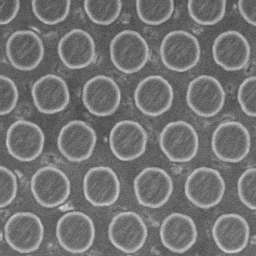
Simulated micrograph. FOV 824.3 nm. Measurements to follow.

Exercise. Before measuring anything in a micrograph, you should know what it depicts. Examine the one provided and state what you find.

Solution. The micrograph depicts a regular array of raised bodies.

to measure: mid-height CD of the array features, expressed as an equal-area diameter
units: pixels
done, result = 38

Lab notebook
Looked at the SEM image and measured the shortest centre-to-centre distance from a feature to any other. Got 165 nm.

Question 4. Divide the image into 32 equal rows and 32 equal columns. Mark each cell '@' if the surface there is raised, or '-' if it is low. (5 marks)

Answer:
@@--@@@@@--@@@@--@@@@@--@@@@--@@
@@--@@@@---@@@@--@@@@---@@@@--@@
@----@@@----@@----@@@---@@@----@
--------------------------------
-@@@@---@@@----@@@---@@@---@@@--
-@@@@--@@@@@--@@@@--@@@@@--@@@@-
-@@@@--@@@@@--@@@@--@@@@@--@@@@-
-@@@@---@@@---@@@@--@@@@@--@@@@-
--@@-----------@@@---@@@----@@--
------@-------------------------
@@--@@@@---@@@---@@@@---@@@---@@
@@--@@@@@--@@@@--@@@@--@@@@@--@@
@@--@@@@@--@@@@--@@@@--@@@@@--@@
@@---@@@---@@@@--@@@@---@@@@--@@
--------------------------------
--@@-----@@----@@----@@-----@@--
-@@@@---@@@@--@@@@--@@@@---@@@@-
-@@@@--@@@@@--@@@@--@@@@@--@@@@-
-@@@@--@@@@@--@@@@--@@@@@--@@@@-
--@@@---@@@----@@----@@@---@@@@-
--------------------------------
@----@@@---@@@----@@@---@@@----@
@@--@@@@---@@@@--@@@@--@@@@@--@@
@@--@@@@@--@@@@--@@@@--@@@@@--@@
@@--@@@@---@@@@--@@@@--@@@@@--@@
@----@@@----@@----@@----@@@----@
--------@-----------------------
-@@@@---@@@---@@@@---@@@---@@@--
-@@@@--@@@@@--@@@@--@@@@---@@@@-
@@@@@--@@@@@--@@@@--@@@@---@@@@-
-@@@@---@@@---@@@@---@@@---@@@@-
---------@------------------@---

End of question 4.